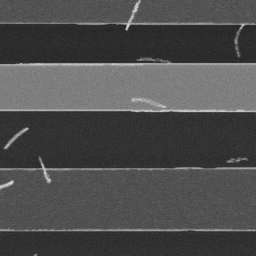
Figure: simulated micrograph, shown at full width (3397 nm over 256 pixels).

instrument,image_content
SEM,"lines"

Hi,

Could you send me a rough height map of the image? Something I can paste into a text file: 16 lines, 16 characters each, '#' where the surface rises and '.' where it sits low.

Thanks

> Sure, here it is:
################
....############
................
................
################
################
################
................
................
................
................
################
################
################
................
................